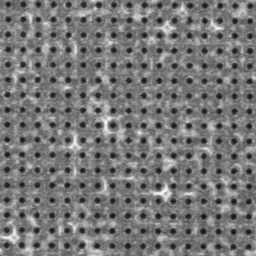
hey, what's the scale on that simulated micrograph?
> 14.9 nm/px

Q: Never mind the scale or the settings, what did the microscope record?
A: a regular array of raised bodies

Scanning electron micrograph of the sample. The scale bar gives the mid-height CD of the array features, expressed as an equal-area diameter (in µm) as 0.122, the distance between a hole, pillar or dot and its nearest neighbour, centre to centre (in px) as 14.6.